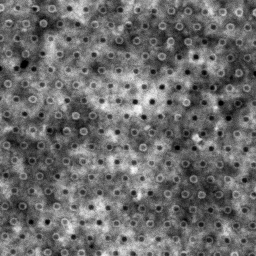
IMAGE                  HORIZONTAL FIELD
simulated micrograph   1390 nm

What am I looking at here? a regular array of raised bodies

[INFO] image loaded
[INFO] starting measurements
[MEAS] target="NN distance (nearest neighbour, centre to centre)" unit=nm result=91.3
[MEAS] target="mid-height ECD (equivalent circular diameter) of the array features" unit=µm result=0.0383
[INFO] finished